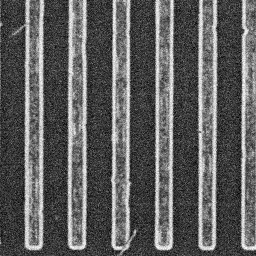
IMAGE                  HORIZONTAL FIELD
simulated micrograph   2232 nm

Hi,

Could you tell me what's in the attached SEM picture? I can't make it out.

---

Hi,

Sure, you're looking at parallel lines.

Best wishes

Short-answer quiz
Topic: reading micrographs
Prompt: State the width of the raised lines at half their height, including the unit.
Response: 121 nm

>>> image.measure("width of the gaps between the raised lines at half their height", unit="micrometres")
0.256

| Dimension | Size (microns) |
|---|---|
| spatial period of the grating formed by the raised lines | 0.378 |